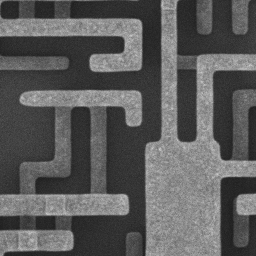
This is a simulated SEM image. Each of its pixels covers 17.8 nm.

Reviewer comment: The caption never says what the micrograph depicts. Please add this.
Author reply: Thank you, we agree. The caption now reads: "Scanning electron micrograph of wiring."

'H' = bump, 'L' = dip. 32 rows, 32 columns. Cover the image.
LLLLLLLLLLLLLLLLLLLLHHLLLLLLLLLL
LLLLLLLLLLLLLLLLLLLLHHLLLLLLLLLL
HHHHHHHHHHHHHHHHHLLLHHLLLLLLLLLL
HHHHHHHHHHHHHHHHHHLLHHLLLLLLLLLL
LLLLLLLLLLLLLLLHHHLLHHLLLLLLLLLL
LLLLLLLLLLLLLLLLHHLLHHLLLLLLLLLL
LLLLLLLLLLLLLLLHHHLLHHLLLLLLLLLL
LLLLLLLLLLLHHHHHHHLLHHLLLHHHHHHH
LLLLLLLLLLLHHHHHHHLLHHLLLHHHHHHH
LLLLLLLLLLLLLLLLLLLLHHLLLHHLLLLL
LLLLLLLLLLLLLLLLLLLLHHLLLHHLLLLL
LLLHHHHHHHHHHHHHHLLLHHLLLHHLLLLL
LLLHHHHHHHHHHHHHHHLLHHLLLHHLLLLL
LLLLLLLLLLLLLLLHHHLLHHLLLHHLLLLL
LLLLLLLLLLLLLLLLHHLLHHLLLHHLLLLL
LLLLLLLLLLLLLLLLHLLLHHLLLHHLLLLL
LLLLLLLLLLLLLLLLLLLLHHLLLHHLLLLL
LLLLLLLLLLLLLLLLLLLLHHLLHHHLLLLL
LLLLLLLLLLLLLLLLLLHHHHHHHHHLLLLL
LLLLLLLLLLLLLLLLLLHHHHHHHHHHLLLL
LLLLLLLLLLLLLLLLLLHHHHHHHHHHHHHH
LLLLLLLLLLLLLLLLLLHHHHHHHHHHHHHH
LLLLLLLLLLLLLLLLLLHHHHHHHHHHLLLL
LLLLLLLLLLLLLLLLLLHHHHHHHHHHLLLL
HHHHHHHHHHHHHHHHLLHHHHHHHHHHLLHH
HHHHHHHHHHHHHHHHLLHHHHHHHHHHLLHH
HHHHHHHHHHHHHHHHLLHHHHHHHHHHLLHH
LLLLLLLLLLLLLLLLLLHHHHHHHHHHLLLL
LLLLLLLLLLLLLLLLLLHHHHHHHHHHLLLL
HHHHHHHHHLLLLLLLLLHHHHHHHHHHLLLL
HHHHHHHHHLLLLLLLLLHHHHHHHHHHLLLL
HLLLLLLLLLLLLLLLLLHHHHHHHHHHLLLL